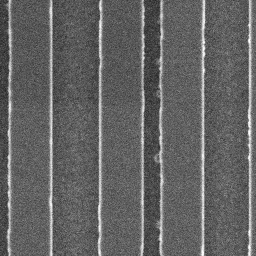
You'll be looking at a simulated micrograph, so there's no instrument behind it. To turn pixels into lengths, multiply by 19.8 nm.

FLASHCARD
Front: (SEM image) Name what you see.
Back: lines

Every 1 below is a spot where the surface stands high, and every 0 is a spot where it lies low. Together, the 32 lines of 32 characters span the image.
01111100000011111100111111000001
01111100000011111100111111000001
01111100000001111100111111000001
01111100000011111100111111000001
01111100000011111100111110000001
01111100000011111100111111000001
01111100000011111100111111000001
01111100000011111100111110000001
01111100000011111100111111000001
01111100000011111100111110000001
01111100000011111100111110000001
01111100000011111100111110000001
01111100000011111100111110000001
01111100000011111100111110000001
01111100000011111100111110000001
01111100000011111100111110000001
01111100000011111100111110000001
01111100000011111100111110000001
01111100000011111100111110000001
01111100000011111100111110000001
01111100000011111100111110000001
01111100000011111100111110000001
01111100000011111100111110000001
01111100000011111100111110000001
01111100000011111100111110000001
01111100000011111100111110000001
01111100000011111100111110000001
01111100000011111100111110000001
01111100000011111100111110000001
01111100000011111100111110000001
01111100000011111100111110000001
01111100000011111100111110000001